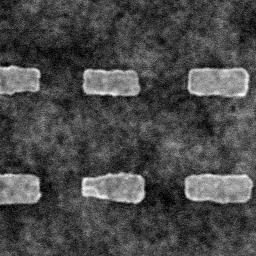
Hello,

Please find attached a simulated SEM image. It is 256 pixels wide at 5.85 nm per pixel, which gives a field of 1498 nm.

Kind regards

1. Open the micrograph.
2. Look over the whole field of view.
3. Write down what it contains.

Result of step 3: raised bodies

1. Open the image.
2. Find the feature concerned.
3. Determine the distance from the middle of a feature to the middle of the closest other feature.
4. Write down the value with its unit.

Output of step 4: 0.609 µm